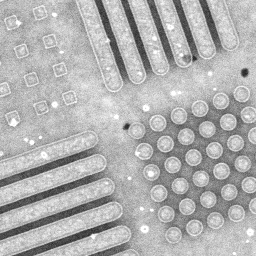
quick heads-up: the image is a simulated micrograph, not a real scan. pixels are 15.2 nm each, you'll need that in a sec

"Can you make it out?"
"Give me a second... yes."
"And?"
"groups of lines, slits or small figures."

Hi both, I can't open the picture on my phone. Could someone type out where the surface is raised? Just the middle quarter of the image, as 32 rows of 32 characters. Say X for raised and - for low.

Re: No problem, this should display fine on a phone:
---------XXXX--XXXXX--XXXX---XX-
X--------XXXX---XXXX--XXXX------
---------XXXXX--XXXX---XX-------
----------XXXX--XXXX------------
----------XXXXX--XX-------------
----------XXXXX-----------------
-----------XXX------------------
XXX-----------------------------
XXX-----------------------------
XXX-----------------------------
--------------------------------
----------------------------XX--
---------------------------XXXX-
----------------------XXX--XXXX-
---------------------XXXX--XXX--
-----------------XXX--XXX-------
----------------XXXX---XX-----XX
----XXXX--------XXXX---------XXX
-XXXXXXX----------X-----XXX--XXX
XXXXXXXX---------------XXXX--XXX
XXXXXXX------------XXX-XXXX-----
XXXXX-------------XXXX--XXX-----
XXX---------------XXXX---------X
------XXXX---------XX------X---X
--XXXXXXXX---------------XXXX--X
XXXXXXXXXX-----------XX--XXXX---
XXXXXXXXX-----------XXXX--XXX---
XXXXXXX-------------XXXX--------
XXXX-----------------XX---------
XX------XXXX---------------XXXX-
----XXXXXXXX-----------XX--XXXX-
--XXXXXXXXXX----------XXX--XXXX-